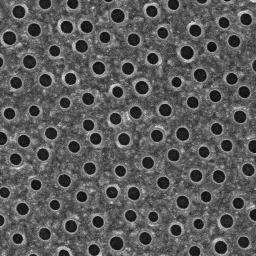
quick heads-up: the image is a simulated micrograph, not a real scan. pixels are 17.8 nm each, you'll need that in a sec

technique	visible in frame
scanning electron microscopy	a regular array of holes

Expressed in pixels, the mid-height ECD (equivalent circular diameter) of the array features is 12.2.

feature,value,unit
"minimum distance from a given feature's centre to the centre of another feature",415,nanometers